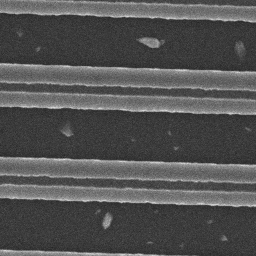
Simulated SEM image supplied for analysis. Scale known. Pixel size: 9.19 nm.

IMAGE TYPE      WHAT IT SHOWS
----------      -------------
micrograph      lines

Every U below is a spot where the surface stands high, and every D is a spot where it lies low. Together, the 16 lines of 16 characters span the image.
UUUUUUUUUUUUUUUU
DDDDDDDDDDDDDDDD
DDDDDDDDDDDDDDDD
DDDDDDDDDDDDDDDD
UUUUUUUUUUUUUUUD
UUUUUUUUUUUUUUUU
UUUUUUUUUUUUUUUU
DDDDDDDDDDDDDDDD
DDDDDDDDDDDDDDDD
DDDDDDDDDDDDDDDD
UUUUUUUUUUUUUUUU
UUUUUUUUUUUUUUUU
DDDUUUUUUUUUUUUU
DDDDDDDDDDDDDDDD
DDDDDDDDDDDDDDDD
DDDDDDDDDDDDDDDD